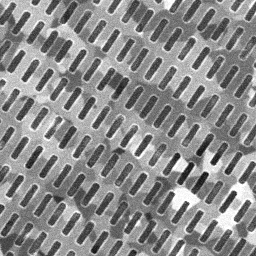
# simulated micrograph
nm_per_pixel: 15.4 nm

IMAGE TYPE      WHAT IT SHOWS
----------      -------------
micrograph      a regular array of holes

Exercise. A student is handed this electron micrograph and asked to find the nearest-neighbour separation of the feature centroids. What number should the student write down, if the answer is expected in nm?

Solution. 261